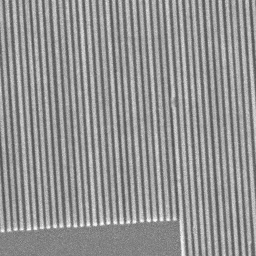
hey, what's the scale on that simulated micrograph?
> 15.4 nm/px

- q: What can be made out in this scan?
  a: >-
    parallel lines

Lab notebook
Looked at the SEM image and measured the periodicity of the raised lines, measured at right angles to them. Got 102 nm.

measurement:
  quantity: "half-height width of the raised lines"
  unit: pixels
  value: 2.62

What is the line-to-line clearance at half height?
53.7 nanometers